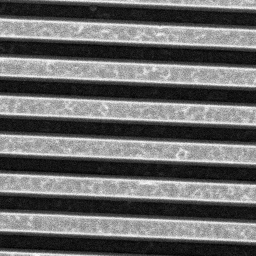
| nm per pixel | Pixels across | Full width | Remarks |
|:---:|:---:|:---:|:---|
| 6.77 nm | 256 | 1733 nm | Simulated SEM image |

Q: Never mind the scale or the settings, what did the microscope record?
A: parallel lines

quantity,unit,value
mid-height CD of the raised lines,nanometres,136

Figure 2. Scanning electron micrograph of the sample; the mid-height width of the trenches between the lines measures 124 nm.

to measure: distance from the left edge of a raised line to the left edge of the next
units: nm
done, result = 262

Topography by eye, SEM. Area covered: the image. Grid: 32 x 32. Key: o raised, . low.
..............oooooooooooooooooo
................................
oooooo..........................
ooooooooooooooooooooooooooooo...
oooooooooooooooooooooooooooooooo
...................ooooooooooooo
................................
ooooooooo.......................
oooooooooooooooooooooooooooooooo
oooooooooooooooooooooooooooooooo
.....................ooooooooooo
................................
ooooooooooooo...................
oooooooooooooooooooooooooooooooo
...ooooooooooooooooooooooooooooo
.........................ooooooo
................................
ooooooooooooooooo...............
oooooooooooooooooooooooooooooooo
.....ooooooooooooooooooooooooooo
..............................oo
................................
ooooooooooooooooooo.............
oooooooooooooooooooooooooooooooo
.........ooooooooooooooooooooooo
................................
o...............................
oooooooooooooooooooooooo........
oooooooooooooooooooooooooooooooo
............oooooooooooooooooooo
................................
ooo.............................